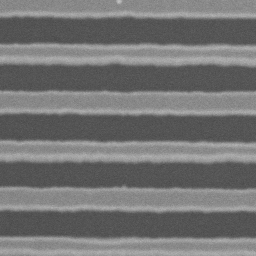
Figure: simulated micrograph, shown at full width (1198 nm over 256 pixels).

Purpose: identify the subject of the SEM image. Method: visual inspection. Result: lines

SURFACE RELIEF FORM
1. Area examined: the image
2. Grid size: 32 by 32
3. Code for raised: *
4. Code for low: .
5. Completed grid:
********************************
********************************
................................
................................
................................
....*...........................
********************************
********************************
................................
................................
................................
***..****...**..................
********************************
********************************
................................
................................
................................
................................
********************************
********************************
................................
................................
................................
****..***.....*.................
********************************
********************************
................................
................................
................................
................................
********************************
********************************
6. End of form